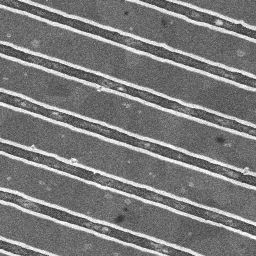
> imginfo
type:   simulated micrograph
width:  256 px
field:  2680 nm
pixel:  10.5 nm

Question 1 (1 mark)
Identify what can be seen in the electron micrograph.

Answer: parallel lines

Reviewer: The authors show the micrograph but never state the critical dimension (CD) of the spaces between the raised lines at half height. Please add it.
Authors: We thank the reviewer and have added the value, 126 nm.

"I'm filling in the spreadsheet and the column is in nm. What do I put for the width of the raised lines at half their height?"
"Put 358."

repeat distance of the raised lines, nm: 488